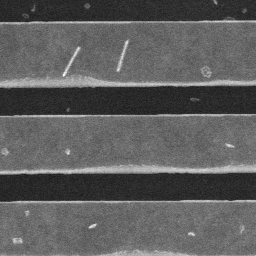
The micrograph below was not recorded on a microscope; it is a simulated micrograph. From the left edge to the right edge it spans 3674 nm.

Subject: lines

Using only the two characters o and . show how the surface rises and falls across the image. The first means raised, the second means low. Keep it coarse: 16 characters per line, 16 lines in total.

................
oooooooooooooooo
oooooooooooooooo
oooooooooooooooo
oooooooooooooooo
................
................
oooooooooooooooo
oooooooooooooooo
oooooooooooooooo
oooooooooooooooo
................
................
oooooooooooooooo
oooooooooooooooo
oooooooooooooooo